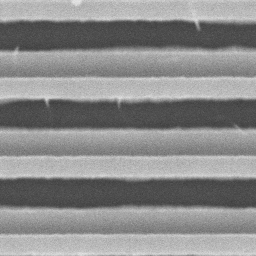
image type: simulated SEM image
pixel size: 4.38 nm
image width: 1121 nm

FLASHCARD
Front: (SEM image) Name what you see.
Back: lines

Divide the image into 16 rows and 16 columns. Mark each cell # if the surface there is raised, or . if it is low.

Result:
################
................
................
################
################
################
................
................
################
################
################
................
................
################
################
################